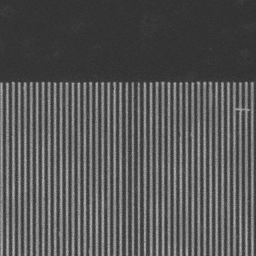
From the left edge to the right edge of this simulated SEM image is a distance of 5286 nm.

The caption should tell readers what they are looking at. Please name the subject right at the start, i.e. parallel lines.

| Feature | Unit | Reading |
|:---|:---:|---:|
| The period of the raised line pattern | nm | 123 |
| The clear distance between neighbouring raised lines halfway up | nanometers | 77.4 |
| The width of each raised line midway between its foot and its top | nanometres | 46.5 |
